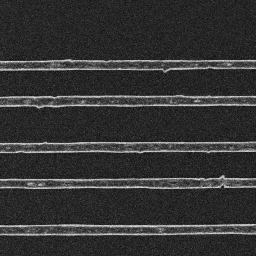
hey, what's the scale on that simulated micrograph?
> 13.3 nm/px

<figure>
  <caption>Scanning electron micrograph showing parallel lines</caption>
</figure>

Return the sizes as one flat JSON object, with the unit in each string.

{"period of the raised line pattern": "548 nm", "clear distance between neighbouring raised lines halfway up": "0.437 µm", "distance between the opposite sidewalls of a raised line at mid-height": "118 nm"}